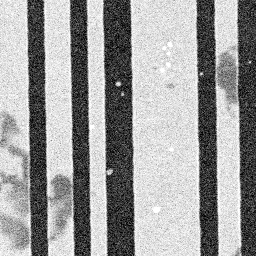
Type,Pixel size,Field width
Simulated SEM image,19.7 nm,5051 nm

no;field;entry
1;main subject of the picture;groups of lines, slits or small figures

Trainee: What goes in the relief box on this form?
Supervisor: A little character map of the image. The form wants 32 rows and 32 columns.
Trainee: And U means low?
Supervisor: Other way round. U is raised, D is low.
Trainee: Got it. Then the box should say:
UUUDDDUUUDDUUDDDUUUUUUUUDDDUUUDD
UUUDDDUUUDDUUDDDUUUUUUUUDDDUUUDD
UUUDDDUUUDDUUDDDUUUUUUUUDDDUUUDD
UUUDDDUUUDDUUDDDUUUUUUUUDDDUUUDD
UUUDDDUUUDDUUDDDDUUUUUUUDDDUUUDD
UUUDDDUUUDDUUDDDDUUUUUUUUDDUUUDD
UUUDDDUUUDDUUDDDDUUUUUUUUDDUUUDD
UUUDDDUUUDDUUDDDDUUUUUUUUDDUUUDD
UUUDDDUUUDDUUDDDDUUUUUUUUDDUUUDD
UUUDDDUUUDDUUDDDDUUUUUUUUDDUUUDD
UUUDDDUUUDDUUDDDDUUUUUUUUDDUUUDD
UUUDDDUUUDDUUDDDDUUUUUUUUDDUUUDD
UUUDDDUUUDDUUDDDDUUUUUUUUDDUUUDD
UUUUDDUUUDDUUDDDDUUUUUUUUDDUUUDD
UUUUDDUUUDDUUDDDDUUUUUUUUDDUUUDD
UUUUDDUUUDDUUDDDDUUUUUUUUDDUUUDD
UUUUDDUUUDDUUDDDDUUUUUUUUDDUUUDD
UUUUDDUUUDDUUDDDDUUUUUUUUDDUUUDD
UUUUDDUUUDDUUDDDDUUUUUUUUDDUUUDD
UUUUDDUUUDDUUDDDDUUUUUUUUDDUUUDD
UUUUDDUUUDDUUDDDDUUUUUUUUDDUUUDD
UUUUDDUUUDDUUDDDDUUUUUUUUDDUUUDD
UUUUDDUUUDDUUDDDDUUUUUUUUDDUUUDD
UUUUDDUUUDDUUDDDDUUUUUUUUDDUUUDD
UUUUDDUUUDDUUDDDDUUUUUUUUDDUUUDD
UUUUDDUUUDDUUDDDDUUUUUUUUDDUUUDD
UUUUDDUUUDDUUDDDDUUUUUUUUDDUUUDD
UUUUDDUUUDDUUDDDDUUUUUUUUDDUUUDD
UUUUDDUUUDDUUDDDDUUUUUUUUDDUUUDD
UUUUDDUUUDDUUDDDDUUUUUUUUDDUUUDD
UUUUDDUUUDDUUDDDDUUUUUUUUDDUUUDD
UUUUDDUUUDDUUDDDDUUUUUUUUDDUUUDD